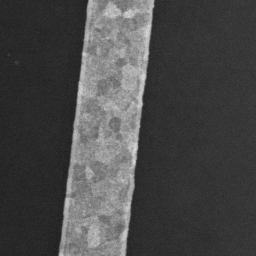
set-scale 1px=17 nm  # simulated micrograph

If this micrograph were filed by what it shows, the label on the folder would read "one or a few lines or trenches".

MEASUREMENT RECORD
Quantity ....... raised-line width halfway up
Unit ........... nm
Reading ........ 1020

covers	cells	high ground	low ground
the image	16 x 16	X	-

------XXX-------
------XXX-------
-----XXXX-------
-----XXXX-------
-----XXXX-------
-----XXXX-------
-----XXXX-------
-----XXXX-------
-----XXX--------
-----XXX--------
----XXXX--------
----XXXX--------
----XXXX--------
----XXXX--------
----XXXX--------
----XXXX--------